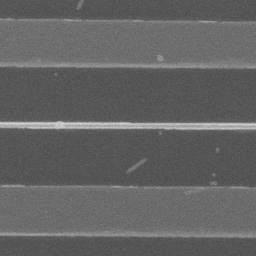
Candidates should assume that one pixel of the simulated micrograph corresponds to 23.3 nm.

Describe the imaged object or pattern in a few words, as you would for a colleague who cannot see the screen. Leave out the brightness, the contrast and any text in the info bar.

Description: lines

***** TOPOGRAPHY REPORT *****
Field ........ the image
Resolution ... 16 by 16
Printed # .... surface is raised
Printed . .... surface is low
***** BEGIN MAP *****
................
################
################
################
................
................
................
................
................
................
................
................
################
################
################
................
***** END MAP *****